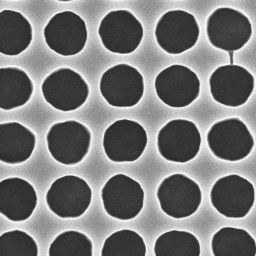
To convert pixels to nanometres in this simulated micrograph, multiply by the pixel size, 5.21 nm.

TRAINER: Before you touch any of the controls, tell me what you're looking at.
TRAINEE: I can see a regular array of holes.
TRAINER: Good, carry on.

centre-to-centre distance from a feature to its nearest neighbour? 0.28 µm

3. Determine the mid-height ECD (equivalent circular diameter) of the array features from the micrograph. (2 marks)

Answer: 228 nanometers